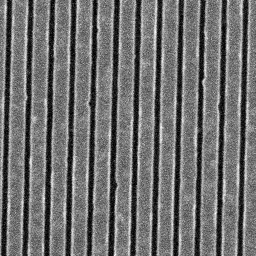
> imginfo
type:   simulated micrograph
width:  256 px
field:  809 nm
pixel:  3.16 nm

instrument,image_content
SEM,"parallel lines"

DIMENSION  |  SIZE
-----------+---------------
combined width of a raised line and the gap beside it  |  68 nanometres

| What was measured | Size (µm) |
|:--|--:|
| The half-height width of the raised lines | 0.0498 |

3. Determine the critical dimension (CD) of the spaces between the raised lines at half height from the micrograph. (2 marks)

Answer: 20.2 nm